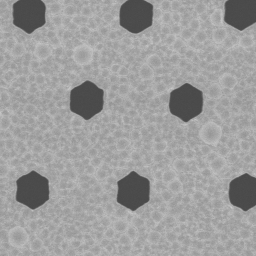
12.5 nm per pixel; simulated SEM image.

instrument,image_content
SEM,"holes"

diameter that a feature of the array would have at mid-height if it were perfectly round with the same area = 0.438 microns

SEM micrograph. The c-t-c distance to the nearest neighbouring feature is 1250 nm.